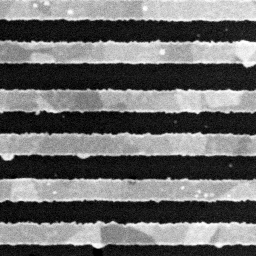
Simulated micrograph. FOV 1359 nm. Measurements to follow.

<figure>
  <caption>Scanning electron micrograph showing lines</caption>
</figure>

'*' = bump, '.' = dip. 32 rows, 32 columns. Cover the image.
********************************
********************************
...................*.***..**.*.*
................................
................................
********************************
********************************
********************************
................................
................................
................................
********************************
********************************
********************************
................................
................................
................................
********************************
********************************
**..............................
................................
................................
*****************.***.**.*..*.*.
********************************
********************************
................................
................................
................................
********************************
********************************
.*.*.**..**.*.***********.***.**
................................